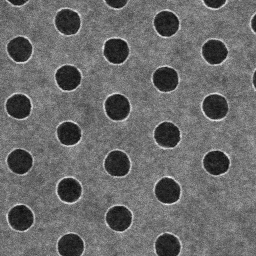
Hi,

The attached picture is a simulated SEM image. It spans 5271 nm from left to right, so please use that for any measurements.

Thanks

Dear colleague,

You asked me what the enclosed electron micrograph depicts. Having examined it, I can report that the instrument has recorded a regular array of holes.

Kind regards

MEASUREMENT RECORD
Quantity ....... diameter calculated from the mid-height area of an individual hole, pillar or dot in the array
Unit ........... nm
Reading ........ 538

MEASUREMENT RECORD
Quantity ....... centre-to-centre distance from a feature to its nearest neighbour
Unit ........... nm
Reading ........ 1140